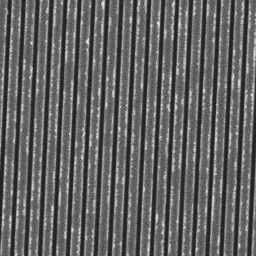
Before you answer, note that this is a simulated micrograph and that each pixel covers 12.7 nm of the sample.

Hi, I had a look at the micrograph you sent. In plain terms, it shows parallel lines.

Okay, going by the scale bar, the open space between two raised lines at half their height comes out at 58.7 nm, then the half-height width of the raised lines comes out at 119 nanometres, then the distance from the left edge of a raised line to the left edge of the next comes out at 177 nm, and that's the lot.